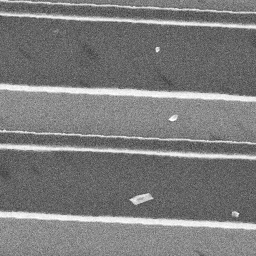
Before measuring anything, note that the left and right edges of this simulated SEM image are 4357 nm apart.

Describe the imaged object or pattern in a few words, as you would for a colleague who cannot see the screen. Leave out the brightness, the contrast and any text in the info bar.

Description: lines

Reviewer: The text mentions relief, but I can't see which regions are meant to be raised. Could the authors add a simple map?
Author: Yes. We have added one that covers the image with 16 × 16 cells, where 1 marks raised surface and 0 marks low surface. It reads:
1111111111111111
0000000000000111
0000000000000000
0000000000000000
0000000000000000
0000000000000000
1111111111111111
1111111111111111
1111111111111111
0000000001111111
0000000000000000
0000000000000000
0000000000000000
1000000000000000
1111111111111111
1111111111111111